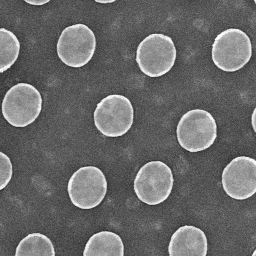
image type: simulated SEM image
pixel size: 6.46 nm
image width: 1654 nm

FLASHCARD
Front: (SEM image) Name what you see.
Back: a regular array of raised bodies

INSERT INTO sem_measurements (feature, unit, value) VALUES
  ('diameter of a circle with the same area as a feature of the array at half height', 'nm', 261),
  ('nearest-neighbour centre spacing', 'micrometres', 0.478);